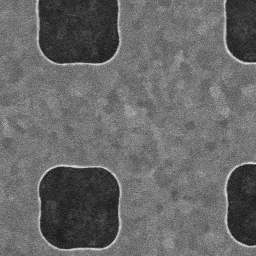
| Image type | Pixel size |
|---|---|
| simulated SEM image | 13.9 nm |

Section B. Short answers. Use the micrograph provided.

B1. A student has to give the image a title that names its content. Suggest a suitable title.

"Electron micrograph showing holes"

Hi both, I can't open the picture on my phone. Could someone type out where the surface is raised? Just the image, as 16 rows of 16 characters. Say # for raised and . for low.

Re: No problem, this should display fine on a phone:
##.....#######..
##.....#######..
##.....#######..
###....########.
################
################
################
################
################
################
####..#########.
###....#######..
###....#######..
###....#######..
###....#######..
####..##########